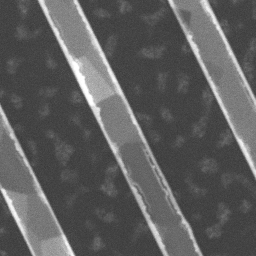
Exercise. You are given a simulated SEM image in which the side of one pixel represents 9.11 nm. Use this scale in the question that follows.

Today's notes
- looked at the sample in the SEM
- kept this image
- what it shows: one or a few lines or trenches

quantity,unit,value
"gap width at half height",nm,752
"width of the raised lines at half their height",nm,304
